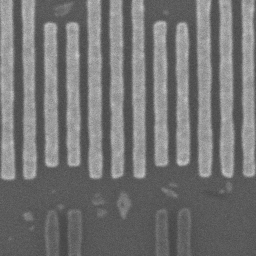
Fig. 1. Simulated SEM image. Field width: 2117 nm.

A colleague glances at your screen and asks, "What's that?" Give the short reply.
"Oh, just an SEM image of wiring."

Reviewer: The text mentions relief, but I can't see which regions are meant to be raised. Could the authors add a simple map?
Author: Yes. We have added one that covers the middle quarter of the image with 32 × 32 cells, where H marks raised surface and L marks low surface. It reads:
LHHHLLHHHLLLHHLLLHHHLLLHHHLLHHHL
LHHHLLHHHLLLHHLLLHHHLLLHHHLLHHHL
LHHHLLHHHLLLHHLLLHHHLLLHHHLLHHHL
LHHHLLHHHLLLHHHLLHHHLLLHHHLLHHHL
LHHHLLHHHLLLHHHLLHHHLLLHHHLLHHHL
LHHHLLHHHLLLHHHLLHHHLLLHHLLLHHHL
LHHHLLHHHLLLHHHLLHHHLLLHHHLLHHHL
LHHHLLHHHLLLHHHLLHHHLLLHHHLLHHHL
LHHHLLHHHLLLHHHLLHHHLLLHHHLLHHHL
LHHHLLHHHLLLHHHLLHHHLLLHHHLLHHHL
LHHHLLHHHLLLHHHLLHHHLLLHHHLLHHHL
LHHHLLHHHLLLHHHLLHHHLLLHHHLLHHHL
LHHHLLHHHLLLHHHLLHHHLLLHHHLLHHHL
LHHHLLHHHLLLHHHLLHHHLLLHHHLLHHHL
LHHHLLHHHLLLHHHLLHHHLLLHHHLLHHHL
LHHHLLHHHLLLHHHLLHHHLLLHHHLLHHHL
LHHHLLHHHLLLHHHLLHHHLLLHHHLLHHHL
LHHHLLHHHLLLHHHLLHHHLLLHHHLLHHHL
LHHHLLHHHLLLHHHLLHHHLLLHHHLLHHHL
LHHHLLHHHLLLHHHLLHHHLLLHHHLLHHHL
LHHHLLHHHLLLHHHLLHHHLLLHHHLLHHHL
LHHHLLHHHLLLHHHLLHHHLLLHHHLLHHHL
LHHHLLHHHLLLHHHLLHHHLLLHHHLLHHHL
LHHHLLHHHLLLHHHLLHHHLLLHHHLLHHHL
LHHHLLHHHLLLHHHLLHHHLLLHHHLLHHHL
LLLLLLHHHLLLHHHLLLHHLLLLLLLLLLLL
LLLLLLHHHLLLHHHLLLHHLLLLLLLLLLLL
LLLLLLLHHLLLHHHLLLHHLLLLLLLLLLLL
LLLLLLLLLLLLLLLLLLLLLLLLLLLLLLLL
LLLLLLLLLLLLLLLLLLLLLLLLLLLLLLLL
LLLLLLLLLLLLLLLLLLLLLLLLLLLLLLLL
LLLLLLLLLLLLLLLLLLLLLLLLLHLLLLLL